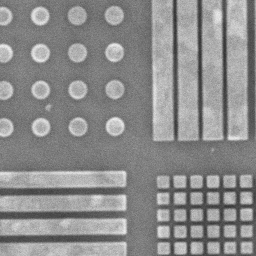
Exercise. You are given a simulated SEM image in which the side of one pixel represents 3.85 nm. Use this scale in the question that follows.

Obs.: groups of lines, slits or small figures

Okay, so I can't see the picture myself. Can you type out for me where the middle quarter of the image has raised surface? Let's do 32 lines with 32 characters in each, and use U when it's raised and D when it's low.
DDDDDDDDDDDDDDDDDDDDDDDUUUUDDUUU
DDDDDDDDDDDDDDDDDDDDDDDUUUUDDUUU
DDDDDDDDDDDDDDDDDDDDDDDUUUUDDUUU
DDDDDDDDDDDDDDDDDDDDDDDUUUUDDUUU
DDUUUDDDDDDDUUDDDDDDDDDUUUUDDUUU
DDUUUDDDDDDUUUUDDDDDDDDUUUUDDUUU
DDUUUDDDDDDUUUUDDDDDDDDUUUUDDUUU
DDUUUDDDDDDUUUUDDDDDDDDUUUUDDUUU
DDDDDDDDDDDDDDDDDDDDDDDUUUUDDUUU
DDDDDDDDDDDDDDDDDDDDDDDUUUUDDUUU
DDDDDDDDDDDDDDDDDDDDDDDUUUUDDUUU
DDDDDDDDDDDDDDDDDDDDDDDUUUUDDUUU
DDDDDDDDDDDDDDDDDDDDDDDUUUUDDUUU
DDDDDDDDDDDDDDDDDDDDDDDUUUUDDUUU
DDUUUDDDDDDUUUDDDDDDDDDUUUUDDUUU
DDUUUUDDDDDUUUUDDDDDDDDUUUUDDUUU
DDUUUDDDDDDUUUUDDDDDDDDUUUUDDUUU
DDUUUDDDDDDDUUDDDDDDDDDUUUUDDUUU
DDDDDDDDDDDDDDDDDDDDDDDUUUUDDUUU
DDDDDDDDDDDDDDDDDDDDDDDDDDDDDDDD
DDDDDDDDDDDDDDDDDDDDDDDDDDDDDDDD
DDDDDDDDDDDDDDDDDDDDDDDDDDDDDDDD
DDDDDDDDDDDDDDDDDDDDDDDDDDDDDDDD
DDDDDDDDDDDDDDDDDDDDDDDDDDDDDDDD
DDDDDDDDDDDDDDDDDDDDDDDDDDDDDDDD
DDDDDDDDDDDDDDDDDDDDDDDDDDDDDDDD
DDDDDDDDDDDDDDDDDDDDDDDDDDDDDDDD
UUUUUUUUUUUUUUUDDDDDDDDDDDDDDDDD
UUUUUUUUUUUUUUUDDDDDDDDDUUDDUUDD
UUUUUUUUUUUUUUUDDDDDDDDUUUDDUUDD
UUUUUUUUUUUDDDDDDDDDDDDDUUDDUUDD
DDDDDDDDDDDDDDDDDDDDDDDDDDDDDDDD